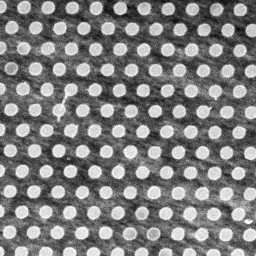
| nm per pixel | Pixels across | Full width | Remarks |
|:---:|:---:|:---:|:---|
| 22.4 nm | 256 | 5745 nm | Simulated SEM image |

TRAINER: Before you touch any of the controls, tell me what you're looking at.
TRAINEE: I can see a regular array of raised bodies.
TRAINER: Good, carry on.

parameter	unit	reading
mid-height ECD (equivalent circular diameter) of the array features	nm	273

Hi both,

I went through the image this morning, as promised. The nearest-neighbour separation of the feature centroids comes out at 528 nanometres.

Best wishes